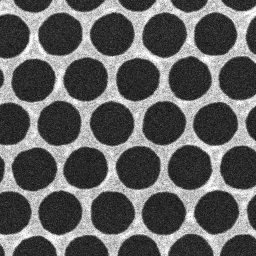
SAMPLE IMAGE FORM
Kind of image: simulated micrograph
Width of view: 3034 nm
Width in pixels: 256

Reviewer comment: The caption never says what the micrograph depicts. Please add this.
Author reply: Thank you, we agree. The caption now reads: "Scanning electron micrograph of a regular array of holes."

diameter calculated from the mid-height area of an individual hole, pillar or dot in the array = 527 nanometers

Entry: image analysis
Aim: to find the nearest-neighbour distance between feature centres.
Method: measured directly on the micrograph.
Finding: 51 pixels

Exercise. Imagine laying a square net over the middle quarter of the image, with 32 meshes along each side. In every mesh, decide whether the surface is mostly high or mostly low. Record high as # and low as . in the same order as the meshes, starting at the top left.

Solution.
#.........####.........####.....
...........##...........##......
...........##...........##......
...........##...........##......
...........##...........##......
...........##...........##......
#.........###..........####.....
#.........####........#####.....
##......#######......#######....
.#########...##########....#####
..#######......######.......####
...#####........#####........###
....###..........###..........##
....##...........###...........#
....##............##...........#
....##............##...........#
....###..........##...........##
....###..........###..........##
....####........####.........###
..#######.......######......####
#####.#####..#####..##########..
###......######.......######....
#.........####.........####.....
#..........###..........###.....
...........##...........##......
...........##...........##......
...........##...........##......
...........##...........##......
..........####..........##......
#.........####.........####.....
##.......######.......######....
##################.###########..